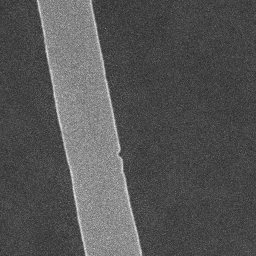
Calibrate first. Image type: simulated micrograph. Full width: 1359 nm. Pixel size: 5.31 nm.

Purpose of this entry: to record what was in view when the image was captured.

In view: one or a few lines or trenches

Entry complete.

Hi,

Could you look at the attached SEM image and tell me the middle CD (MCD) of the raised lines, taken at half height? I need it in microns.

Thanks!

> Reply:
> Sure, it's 0.283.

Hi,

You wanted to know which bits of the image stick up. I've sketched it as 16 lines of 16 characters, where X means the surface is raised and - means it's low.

--XXXX----------
---XXX----------
---XXX----------
---XXX----------
---XXXX---------
---XXXX---------
---XXXX---------
----XXX---------
----XXX---------
----XXX---------
----XXXX--------
-----XXX--------
-----XXX--------
-----XXX--------
-----XXXX-------
-----XXXX-------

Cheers